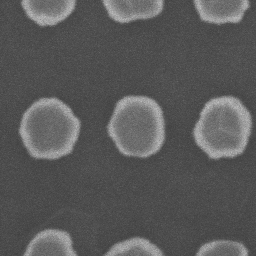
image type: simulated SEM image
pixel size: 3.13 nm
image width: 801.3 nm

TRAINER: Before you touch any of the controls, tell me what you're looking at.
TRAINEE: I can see raised bodies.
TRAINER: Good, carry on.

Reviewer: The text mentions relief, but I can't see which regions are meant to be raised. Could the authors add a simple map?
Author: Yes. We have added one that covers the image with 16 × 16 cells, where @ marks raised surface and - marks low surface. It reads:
--@@---@@@--@@@-
----------------
----------------
----------------
----------------
----------------
--@@----@@---@@-
--@@@--@@@--@@@-
--@@@--@@@--@@@-
--@@----@----@@-
----------------
----------------
----------------
----------------
----------------
--@@---@@----@@-